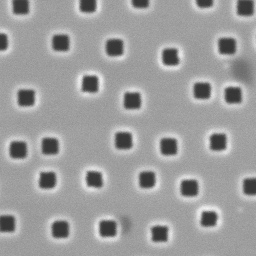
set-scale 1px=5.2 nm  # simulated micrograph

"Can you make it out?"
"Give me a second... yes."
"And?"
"a regular array of holes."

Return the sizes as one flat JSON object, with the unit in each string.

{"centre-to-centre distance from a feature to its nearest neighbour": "42.2 pixels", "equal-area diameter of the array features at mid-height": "103 nm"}